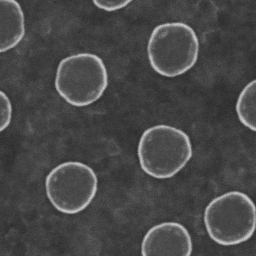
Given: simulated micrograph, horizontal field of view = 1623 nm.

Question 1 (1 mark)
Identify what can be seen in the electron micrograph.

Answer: raised bodies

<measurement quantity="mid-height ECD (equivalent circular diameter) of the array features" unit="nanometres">316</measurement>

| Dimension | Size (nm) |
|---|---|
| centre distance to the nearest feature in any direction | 620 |